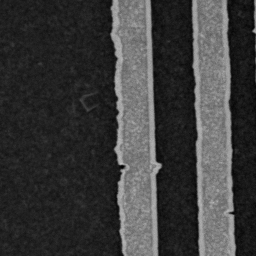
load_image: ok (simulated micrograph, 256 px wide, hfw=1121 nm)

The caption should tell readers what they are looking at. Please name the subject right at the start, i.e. one or a few lines or trenches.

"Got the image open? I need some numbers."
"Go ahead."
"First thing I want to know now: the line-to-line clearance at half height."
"201 nm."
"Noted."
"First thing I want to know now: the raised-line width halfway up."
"0.139 µm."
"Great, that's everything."